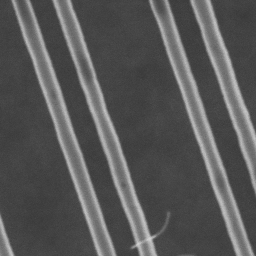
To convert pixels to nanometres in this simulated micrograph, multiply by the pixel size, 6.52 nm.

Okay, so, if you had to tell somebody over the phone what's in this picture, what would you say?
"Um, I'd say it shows lines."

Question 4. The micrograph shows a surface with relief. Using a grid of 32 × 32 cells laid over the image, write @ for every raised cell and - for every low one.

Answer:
--@@---@@----------@@---@@------
--@@---@@----------@@---@@@-----
--@@@--@@@----------@@---@@-----
---@@---@@----------@@---@@-----
---@@---@@----------@@---@@@----
---@@@--@@@----------@@---@@----
----@@---@@----------@@---@@----
----@@---@@----------@@---@@@---
----@@@---@@----------@@---@@---
-----@@---@@----------@@---@@---
-----@@---@@----------@@@--@@@--
-----@@@---@@----------@@---@@--
------@@---@@----------@@---@@--
------@@---@@----------@@---@@@-
------@@@---@@----------@@---@@-
-------@@---@@----------@@---@@-
-------@@---@@----------@@----@@
-------@@@---@@----------@@---@@
--------@@---@@----------@@---@@
--------@@---@@----------@@---@@
--------@@@---@@----------@@---@
---------@@---@@----------@@---@
---------@@---@@----------@@---@
---------@@@---@@----------@@---
----------@@---@@----------@@---
----------@@---@@----------@@@--
----------@@@---@@----------@@--
-----------@@---@@----------@@--
-----------@@---@@----------@@@-
@-----------@@---@@----------@@-
@-----------@@---@@----------@@-
@@----------@@---@@----------@@@